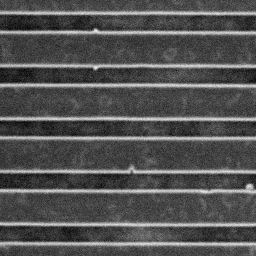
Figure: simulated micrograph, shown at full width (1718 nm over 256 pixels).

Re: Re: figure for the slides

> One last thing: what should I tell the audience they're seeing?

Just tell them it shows parallel lines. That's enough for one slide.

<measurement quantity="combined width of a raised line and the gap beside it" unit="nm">354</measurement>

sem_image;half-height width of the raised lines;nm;234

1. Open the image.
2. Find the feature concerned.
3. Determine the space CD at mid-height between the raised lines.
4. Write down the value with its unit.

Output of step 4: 123 nanometers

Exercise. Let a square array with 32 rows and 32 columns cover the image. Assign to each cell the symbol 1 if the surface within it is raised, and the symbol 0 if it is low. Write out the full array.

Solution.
11111111111111111111111111111111
11111111111111111111111111111111
00000000000000000000000000000000
00000000000000000000000000000000
11111111111111111111111111111111
11111111111111111111111111111111
11111111111111111111111111111111
11111111111111111111111111111111
00000000000000000000000000000000
00000000000000000000000000000000
00000000000000000000000000000000
11111111111111111111111111111111
11111111111111111111111111111111
11111111111111111111111111111111
11111111111111111111111111111111
00000000000000000000000000000000
00000000000000000000000000000000
11111111111111111111111111111111
11111111111111111111111111111111
11111111111111111111111111111111
11111111111111111111111111111111
11110000000011111111111000000001
00000000000000000000000000000000
00000000000000000000000000000000
11111111111111111111111111111111
11111111111111111111111111111111
11111111111111111111111111111111
11111111111111111111111111111111
00000000000000000000000000000000
00000000000000000000000000000000
11111111111101000001111111110111
11111111111111111111111111111111